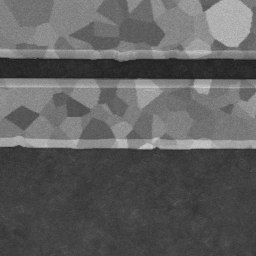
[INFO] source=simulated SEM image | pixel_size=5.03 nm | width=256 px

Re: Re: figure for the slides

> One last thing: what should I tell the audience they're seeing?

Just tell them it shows one or a few lines or trenches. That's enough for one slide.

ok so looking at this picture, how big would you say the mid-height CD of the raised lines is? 301 nm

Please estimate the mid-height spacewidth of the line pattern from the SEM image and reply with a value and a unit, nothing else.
148 nm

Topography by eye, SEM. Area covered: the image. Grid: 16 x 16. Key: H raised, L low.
HHHHHHHHHHHHHHHH
HHHHHHHHHHHHHHHH
HHHHHHHHHHHHHHHH
LLLLLLLLLLLLLLLL
LLLLLLLLLLLLLLLL
HHHHHHHHHHHHHHHH
HHHHHHHHHHHHHHHH
HHHHHHHHHHHHHHHH
HHHHHHHHHHHHHHHH
LLLLLLLLLLLLLLLL
LLLLLLLLLLLLLLLL
LLLLLLLLLLLLLLLL
LLLLLLLLLLLLLLLL
LLLLLLLLLLLLLLLL
LLLLLLLLLLLLLLLL
LLLLLLLLLLLLLLLL